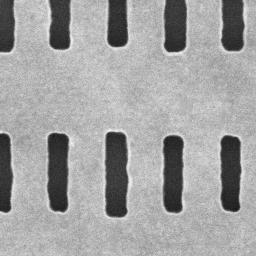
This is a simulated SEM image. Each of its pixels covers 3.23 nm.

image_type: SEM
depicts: holes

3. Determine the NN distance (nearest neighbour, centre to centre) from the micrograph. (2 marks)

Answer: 185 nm